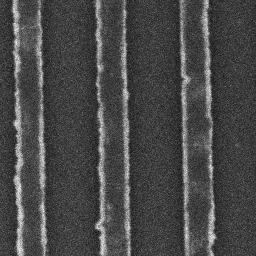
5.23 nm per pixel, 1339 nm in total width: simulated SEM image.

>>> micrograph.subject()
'one or a few lines or trenches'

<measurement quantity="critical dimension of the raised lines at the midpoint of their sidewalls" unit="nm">144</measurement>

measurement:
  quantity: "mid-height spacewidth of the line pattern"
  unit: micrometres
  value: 0.294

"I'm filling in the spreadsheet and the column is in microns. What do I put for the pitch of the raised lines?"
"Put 0.438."